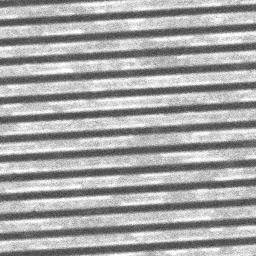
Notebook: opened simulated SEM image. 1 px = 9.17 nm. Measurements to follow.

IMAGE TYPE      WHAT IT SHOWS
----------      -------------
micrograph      parallel lines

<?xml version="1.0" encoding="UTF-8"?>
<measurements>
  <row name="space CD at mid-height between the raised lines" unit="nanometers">75.5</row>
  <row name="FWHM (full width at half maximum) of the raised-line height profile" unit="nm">101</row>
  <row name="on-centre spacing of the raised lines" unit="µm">0.178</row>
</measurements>